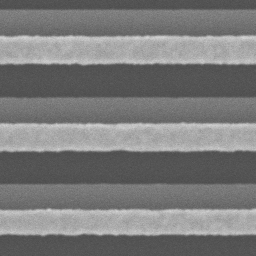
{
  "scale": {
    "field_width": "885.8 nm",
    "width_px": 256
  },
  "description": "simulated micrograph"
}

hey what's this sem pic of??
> lines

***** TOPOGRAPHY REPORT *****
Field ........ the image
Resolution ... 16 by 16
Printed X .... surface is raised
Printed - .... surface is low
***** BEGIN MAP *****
----------------
XXXXXXXXXXXXXXXX
XXXXXXXXXXXXXXXX
XXXXXXXXXXXXXXXX
----------------
----------------
XXXXXXXXXXXXXXXX
XXXXXXXXXXXXXXXX
XXXXXXXXXXXXXXXX
----------------
----------------
----------------
XXXXXXXXXXXXXXXX
XXXXXXXXXXXXXXXX
XXXXXXXXXXXXXXXX
----------------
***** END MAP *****